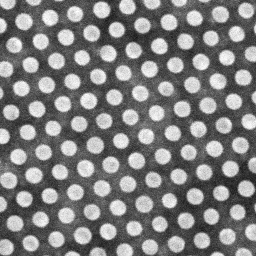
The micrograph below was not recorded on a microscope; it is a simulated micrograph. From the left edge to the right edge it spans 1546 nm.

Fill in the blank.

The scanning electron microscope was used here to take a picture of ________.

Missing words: a regular array of raised bodies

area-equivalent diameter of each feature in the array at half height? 0.0921 microns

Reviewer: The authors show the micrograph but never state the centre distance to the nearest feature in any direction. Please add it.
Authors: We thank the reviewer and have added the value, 0.152 µm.